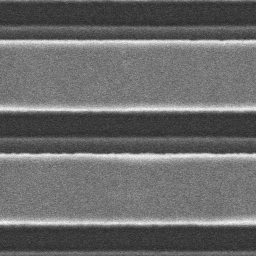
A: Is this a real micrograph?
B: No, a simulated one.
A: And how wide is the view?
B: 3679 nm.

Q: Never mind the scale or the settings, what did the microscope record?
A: lines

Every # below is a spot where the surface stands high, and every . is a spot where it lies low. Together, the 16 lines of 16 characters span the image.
................
................
................
################
################
################
################
................
................
................
################
################
################
################
................
................